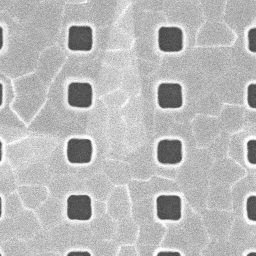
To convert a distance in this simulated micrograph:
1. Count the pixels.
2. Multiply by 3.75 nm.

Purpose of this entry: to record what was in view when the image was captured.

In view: a regular array of holes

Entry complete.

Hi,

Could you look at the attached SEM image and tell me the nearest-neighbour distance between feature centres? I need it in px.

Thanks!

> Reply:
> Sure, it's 56.2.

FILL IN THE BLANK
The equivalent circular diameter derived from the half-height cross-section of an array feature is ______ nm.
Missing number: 104